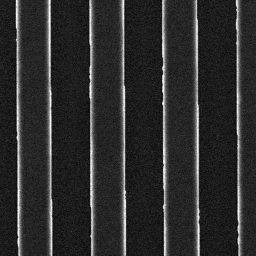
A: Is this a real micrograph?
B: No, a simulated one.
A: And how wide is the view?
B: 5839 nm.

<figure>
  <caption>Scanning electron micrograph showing lines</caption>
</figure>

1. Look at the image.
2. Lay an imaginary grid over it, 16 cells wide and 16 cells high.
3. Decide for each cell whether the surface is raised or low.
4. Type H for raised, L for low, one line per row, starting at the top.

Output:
LHHLLLHHLLHHLLLH
LHHLLLHHLLHHLLLH
LHHLLLHHLLHHLLLH
LHHLLLHHLLHHLLLH
LHHLLLHHLLHHLLLH
LHHLLLHHLLHHLLLH
LHHLLLHHLLHHLLLH
LHHLLLHHLLHHLLLH
LHHLLLHHLLHHLLLH
LHHLLLHHLLHHLLLH
LHHLLLHHLLHHLLLH
LHHLLLHHLLHHLLLH
LHHLLLHHLLHHLLLH
LHHLLLHHLLHHLLLH
LHHLLLHHLLHHLLLH
LHHLLLHHLLHHLLLH